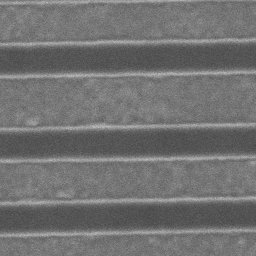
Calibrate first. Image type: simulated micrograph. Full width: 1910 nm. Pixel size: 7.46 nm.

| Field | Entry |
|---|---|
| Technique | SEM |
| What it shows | lines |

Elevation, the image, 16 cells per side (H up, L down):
LLLLLLLLLLLLLLLL
LLLLLLLLLLLLLLLL
LLLLLLLLLLLLLHHH
HHHHHHHHHHHHHHHH
HHHHHHHHHHHHHHHH
LLLLLLLLLLLLLLLL
LLLLLLLLLLLLLLLL
LLLLLLLLLLLLLLLL
HHHHHHHHHHHHHHHH
HHHHHHHHHHHHHHHH
LLLLLLLLLLLLLLLL
LLLLLLLLLLLLLLLL
LLLLLLLHHHHHHHHH
HHHHHHHHHHHHHHHH
HHHHHHHHHHHHHLLL
LLLLLLLLLLLLLLLL